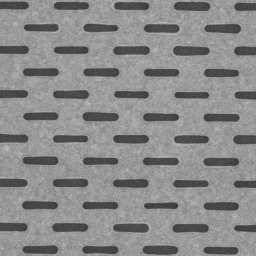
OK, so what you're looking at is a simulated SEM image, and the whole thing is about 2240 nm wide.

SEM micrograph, groups of lines, slits or small figures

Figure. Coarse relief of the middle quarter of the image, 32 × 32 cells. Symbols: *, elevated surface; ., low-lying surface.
********************************
*****.........******.........***
*****.........******.........***
********************************
********************************
********************************
*....***************************
......******.........*******....
......********.......*******....
********************************
********************************
********************************
*****........*******........****
*****.........******.........***
********************************
********************************
********************************
********************************
......******.........******.....
......*******........******.....
********************************
********************************
********************************
*****........*******.........***
*****.........******.........***
************************....****
********************************
********************************
.....***************************
......******.........******.....
......*******........******.....
********************************